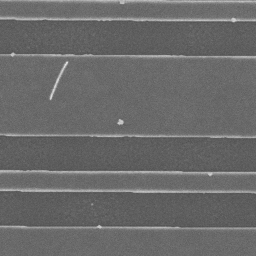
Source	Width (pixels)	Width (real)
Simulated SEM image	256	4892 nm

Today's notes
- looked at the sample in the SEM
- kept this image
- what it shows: lines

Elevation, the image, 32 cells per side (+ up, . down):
++++++++++++++++++++++++++++++++
++++++++++++++++++++++++++++++++
.............+...+.+++++++++++++
................................
................................
................................
................................
++++++++++++++++++++++++++++++++
++++++++++++++++++++++++++++++++
++++++++++++++++++++++++++++++++
++++++++++++++++++++++++++++++++
++++++++++++++++++++++++++++++++
++++++++++++++++++++++++++++++++
++++++++++++++++++++++++++++++++
++++++++++++++++++++++++++++++++
++++++++++++++++++++++++++++++++
++++++++++++++++++++++++++++++++
................................
................................
................................
................................
+++++++++++++++++++++.+.........
++++++++++++++++++++++++++++++++
++++++++++++++++++++++++++++++++
................................
................................
................................
................................
+++++++++++++++++++++++.........
++++++++++++++++++++++++++++++++
++++++++++++++++++++++++++++++++
++++++++++++++++++++++++++++++++